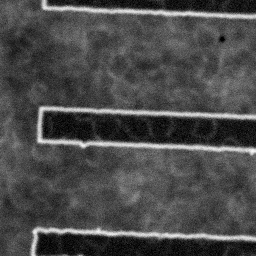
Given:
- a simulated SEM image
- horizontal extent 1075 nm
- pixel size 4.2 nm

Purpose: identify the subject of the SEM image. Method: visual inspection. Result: one or a few lines or trenches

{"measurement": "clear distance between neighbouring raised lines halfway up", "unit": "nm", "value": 394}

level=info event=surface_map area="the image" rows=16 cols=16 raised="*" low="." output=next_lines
...*************
................
................
................
................
................
................
..**************
...*************
................
................
................
................
................
..****..........
..**************